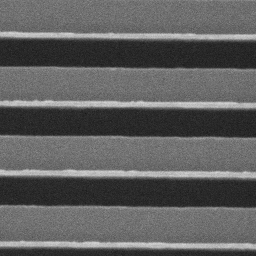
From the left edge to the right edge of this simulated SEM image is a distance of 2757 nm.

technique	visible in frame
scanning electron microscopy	lines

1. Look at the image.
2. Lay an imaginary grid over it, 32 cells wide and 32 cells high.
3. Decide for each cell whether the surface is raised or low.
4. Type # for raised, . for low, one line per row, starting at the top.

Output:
################################
################################
################################
################################
################################
................................
................................
................................
########........................
################################
################################
################################
################################
................................
................................
................................
................................
################################
################################
################################
################################
################################
................................
................................
................................
................................
################################
################################
################################
################################
################################
................................